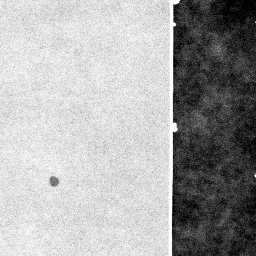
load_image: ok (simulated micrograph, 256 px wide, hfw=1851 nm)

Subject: wiring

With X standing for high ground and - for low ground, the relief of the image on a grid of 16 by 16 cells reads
XXXXXXXXXXX-----
XXXXXXXXXXX-----
XXXXXXXXXXX-----
XXXXXXXXXXX-----
XXXXXXXXXXX-----
XXXXXXXXXXX-----
XXXXXXXXXXX-----
XXXXXXXXXXX-----
XXXXXXXXXXX-----
XXXXXXXXXXX-----
XXXXXXXXXXX-----
XXXXXXXXXXX-----
XXXXXXXXXXX-----
XXXXXXXXXXX-----
XXXXXXXXXXX-----
XXXXXXXXXXX-----